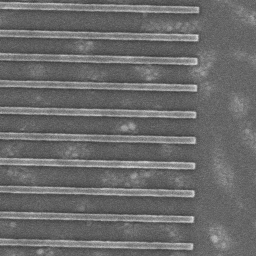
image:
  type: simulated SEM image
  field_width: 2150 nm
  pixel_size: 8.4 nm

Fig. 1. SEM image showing parallel lines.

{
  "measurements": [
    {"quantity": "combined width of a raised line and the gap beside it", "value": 221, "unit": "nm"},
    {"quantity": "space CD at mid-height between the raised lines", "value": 0.173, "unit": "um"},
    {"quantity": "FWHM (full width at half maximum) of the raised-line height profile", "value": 50.4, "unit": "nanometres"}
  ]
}